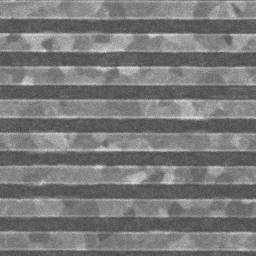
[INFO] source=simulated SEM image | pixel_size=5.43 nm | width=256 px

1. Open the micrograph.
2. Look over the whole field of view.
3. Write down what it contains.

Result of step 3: parallel lines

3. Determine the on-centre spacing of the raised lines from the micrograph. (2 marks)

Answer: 0.179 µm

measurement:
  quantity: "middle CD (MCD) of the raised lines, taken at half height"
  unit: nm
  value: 92.9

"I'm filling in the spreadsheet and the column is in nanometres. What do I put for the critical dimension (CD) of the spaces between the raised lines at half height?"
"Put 88.2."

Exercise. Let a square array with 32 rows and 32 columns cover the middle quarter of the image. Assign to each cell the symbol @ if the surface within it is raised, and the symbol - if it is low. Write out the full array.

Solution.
--------------------------------
@@@@@@@@@@@@@@@@@@@@@@@@@@@@@@@@
@@@@@@@@@@@@@@@@@@@@@@@@@@@@@@@@
@@@@@@@@@@@@@@@@@@@@@@@@@@@@@@@@
@@@@@@@@@@@@@@@@@@@@@@@@@@@@@@@@
--------------------------------
--------------------------------
--------------------------------
--------------------------------
@@@@@@@@@@@@@@@@@@@@@@@@@@@@@@@@
@@@@@@@@@@@@@@@@@@@@@@@@@@@@@@@@
@@@@@@@@@@@@@@@@@@@@@@@@@@@@@@@@
@@@@@@@@@@@@@@@@@@@@@@@@@@@@@@@@
--------------------------------
--------------------------------
--------------------------------
--------------------------------
@@@@@@@@@@@@@@@@@@@@@@@@@@@@@@@@
@@@@@@@@@@@@@@@@@@@@@@@@@@@@@@@@
@@@@@@@@@@@@@@@@@@@@@@@@@@@@@@@@
@@@@@@@@@@@@@@@@@@@@@@@@@@@@@@@@
--------------------------------
--------------------------------
--------------------------------
--------------------------------
--------------------------------
@@@@@@@@@@@@@@@@@@@@@@@@@@@@@@@@
@@@@@@@@@@@@@@@@@@@@@@@@@@@@@@@@
@@@@@@@@@@@@@@@@@@@@@@@@@@@@@@@@
@@@@@@@@@@@@@@@@@@@@@@@@@@@@@@@@
--------------------------------
--------------------------------